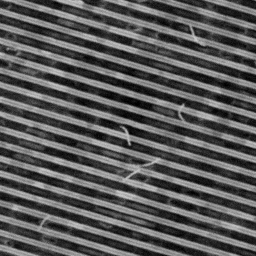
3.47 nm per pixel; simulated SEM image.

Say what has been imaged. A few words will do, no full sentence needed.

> parallel lines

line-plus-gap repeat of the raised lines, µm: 0.0491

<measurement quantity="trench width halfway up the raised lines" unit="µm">0.0354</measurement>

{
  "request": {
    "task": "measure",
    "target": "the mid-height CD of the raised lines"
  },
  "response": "0.0133 microns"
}